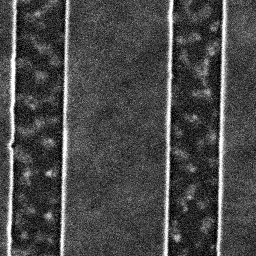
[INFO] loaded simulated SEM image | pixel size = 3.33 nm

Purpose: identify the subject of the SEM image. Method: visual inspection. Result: one or a few lines or trenches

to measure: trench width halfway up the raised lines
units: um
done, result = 0.171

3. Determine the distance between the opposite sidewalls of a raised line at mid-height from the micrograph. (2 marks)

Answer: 0.35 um